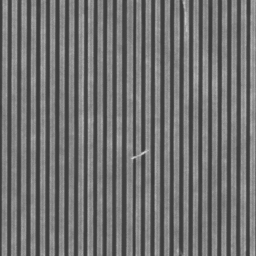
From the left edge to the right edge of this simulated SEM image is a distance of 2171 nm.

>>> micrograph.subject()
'parallel lines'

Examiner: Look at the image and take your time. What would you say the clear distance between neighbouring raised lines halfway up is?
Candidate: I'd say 0.0371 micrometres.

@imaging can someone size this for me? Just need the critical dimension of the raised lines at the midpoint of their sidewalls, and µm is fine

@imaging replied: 0.0445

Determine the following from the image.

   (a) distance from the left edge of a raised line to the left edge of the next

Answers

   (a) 81 nm